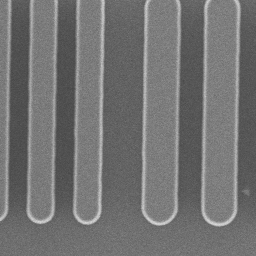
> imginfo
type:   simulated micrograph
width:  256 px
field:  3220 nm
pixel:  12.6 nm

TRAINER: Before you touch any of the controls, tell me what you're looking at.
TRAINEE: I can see groups of lines, slits or small figures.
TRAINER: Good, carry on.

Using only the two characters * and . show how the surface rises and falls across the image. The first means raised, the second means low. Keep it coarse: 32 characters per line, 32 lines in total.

*...***...***.....****....****..
*...***...***.....****....****..
*...***...***.....****....****..
*...***...***.....****....****..
*...***...***.....****....****..
*...***...***.....****....****..
*...***...***.....****....****..
*...***...***.....****....****..
*...***...***.....****....****..
*...***...***.....****....****..
*...***...***.....****....****..
*...***..****.....****....****..
*...***..****.....****....****..
*...***..****.....****....****..
*...***..****.....****....****..
*...***..****.....****...*****..
*...***..****.....****...*****..
*...***..****.....****...*****..
*...***..****.....****...*****..
*...***..****.....****...*****..
*...***..****.....****...*****..
*...***..****.....****...*****..
*...***..****.....****...*****..
*...***..****.....****...*****..
*...***..****.....****...*****..
*..****..****.....****...*****..
*..****..****.....****...*****..
....**....**.......**.....***...
................................
................................
................................
................................